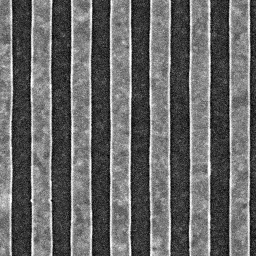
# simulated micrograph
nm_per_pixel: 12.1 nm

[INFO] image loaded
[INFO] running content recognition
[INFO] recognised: parallel lines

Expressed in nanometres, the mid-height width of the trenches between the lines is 245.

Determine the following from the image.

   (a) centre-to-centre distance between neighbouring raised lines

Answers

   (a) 479 nm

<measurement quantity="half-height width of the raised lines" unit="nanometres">236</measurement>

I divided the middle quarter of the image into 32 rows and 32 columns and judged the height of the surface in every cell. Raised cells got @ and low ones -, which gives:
--@@@@------@@@@@-----@@@@------
--@@@@------@@@@@-----@@@@-----@
--@@@@------@@@@@-----@@@@-----@
--@@@@------@@@@@-----@@@@-----@
--@@@@@-----@@@@@-----@@@@-----@
--@@@@@-----@@@@@-----@@@@-----@
--@@@@@-----@@@@@-----@@@@-----@
--@@@@@-----@@@@@-----@@@@------
--@@@@@-----@@@@@-----@@@@------
--@@@@@-----@@@@@-----@@@@------
--@@@@@-----@@@@@-----@@@@------
--@@@@@-----@@@@@-----@@@@------
--@@@@@-----@@@@@-----@@@@------
--@@@@@-----@@@@------@@@@------
--@@@@@-----@@@@------@@@@------
--@@@@@-----@@@@------@@@@------
--@@@@@-----@@@@@-----@@@@------
--@@@@@-----@@@@@-----@@@@------
--@@@@@-----@@@@------@@@@------
--@@@@@-----@@@@------@@@@------
--@@@@------@@@@------@@@@------
--@@@@------@@@@------@@@@------
--@@@@------@@@@------@@@@------
--@@@@@-----@@@@------@@@@------
--@@@@@-----@@@@------@@@@------
--@@@@@-----@@@@------@@@@------
--@@@@@-----@@@@------@@@@------
--@@@@@-----@@@@------@@@@------
--@@@@@-----@@@@------@@@@------
--@@@@@-----@@@@------@@@@------
--@@@@@-----@@@@------@@@@------
--@@@@@-----@@@@------@@@@------